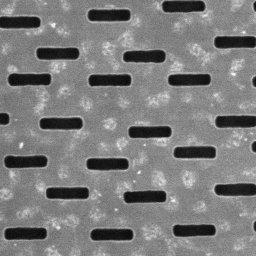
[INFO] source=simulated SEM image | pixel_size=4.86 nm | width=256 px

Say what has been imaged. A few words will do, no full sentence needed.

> a regular array of holes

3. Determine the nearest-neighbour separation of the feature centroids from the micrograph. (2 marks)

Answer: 243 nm